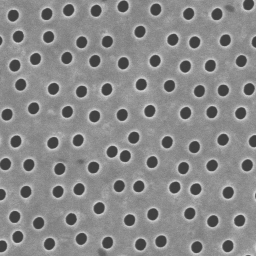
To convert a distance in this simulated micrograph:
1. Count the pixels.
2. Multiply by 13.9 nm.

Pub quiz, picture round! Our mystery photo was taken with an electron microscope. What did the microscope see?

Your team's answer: a regular array of holes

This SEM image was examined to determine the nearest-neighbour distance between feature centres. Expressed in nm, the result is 343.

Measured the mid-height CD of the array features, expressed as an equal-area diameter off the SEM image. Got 11.6 pixels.